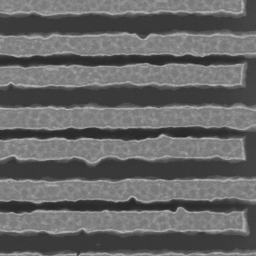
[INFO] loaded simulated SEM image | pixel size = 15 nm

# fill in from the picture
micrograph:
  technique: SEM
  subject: parallel lines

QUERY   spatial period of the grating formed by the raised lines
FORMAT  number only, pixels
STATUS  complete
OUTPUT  35.2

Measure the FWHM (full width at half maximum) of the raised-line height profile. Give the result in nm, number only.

341